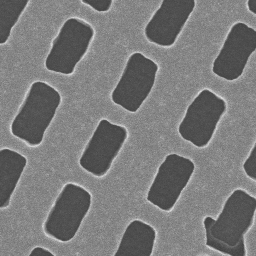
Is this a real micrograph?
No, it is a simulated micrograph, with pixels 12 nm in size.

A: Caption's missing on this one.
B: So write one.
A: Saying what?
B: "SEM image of holes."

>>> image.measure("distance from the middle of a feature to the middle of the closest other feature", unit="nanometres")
874